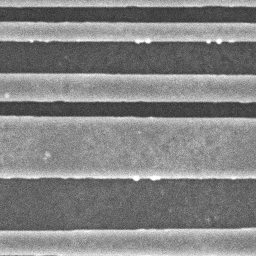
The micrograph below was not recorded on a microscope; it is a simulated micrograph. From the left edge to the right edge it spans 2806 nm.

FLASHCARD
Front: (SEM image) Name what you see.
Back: lines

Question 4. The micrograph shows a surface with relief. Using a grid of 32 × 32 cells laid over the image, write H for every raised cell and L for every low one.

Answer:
HHHHHHHHHHHHHHHHHHHHHHHHHHHHHHHH
LLLLLLLLLLLLLLLLLLLLLLLLLLLLLLLL
LLLLLLLLLLLLLLLLLLLLLLLLLLLLLLLL
HHHHHHHHHHHHHHHHHHHHHHHHHHHHHHHH
HHHHHHHHHHHHHHHHHHHHHHHHHHHHHHHH
LLLLLLLLLLLLLLLLLLLLLLLLLLLLLLLL
LLLLLLLLLLLLLLLLLLLLLLLLLLLLLLLL
LLLLLLLLLLLLLLLLLLLLLLLLLLLLLLLL
LLLLLLLLLLLLLLLLLLLLLLLLLLLLLLLL
HHHHHHHHHHHHHHHHHHHHHHHHHHHHLLLL
HHHHHHHHHHHHHHHHHHHHHHHHHHHHHHHH
HHHHHHHHHHHHHHHHHHHHHHHHHHHHHHHH
HHHHHHHHHHHHHHHHHHHHHHHHHHHHHHHH
LLLLLLLLLLLLLLLLLLLLLLLLLLLLLLLL
LLLLLLLLLLLLLLLLLLLLLLLLLLLLLLLL
HHHHHHHHHHHHHHHHHHHHHHHHHHHHHHHH
HHHHHHHHHHHHHHHHHHHHHHHHHHHHHHHH
HHHHHHHHHHHHHHHHHHHHHHHHHHHHHHHH
HHHHHHHHHHHHHHHHHHHHHHHHHHHHHHHH
HHHHHHHHHHHHHHHHHHHHHHHHHHHHHHHH
HHHHHHHHHHHHHHHHHHHHHHHHHHHHHHHH
HHHHHHHHHHHHHHHHHHHHHHHHHHHHHHHH
LLLLLLLLLLLLLLLLLLLLLLLLLLLLLLLL
LLLLLLLLLLLLLLLLLLLLLLLLLLLLLLLL
LLLLLLLLLLLLLLLLLLLLLLLLLLLLLLLL
LLLLLLLLLLLLLLLLLLLLLLLLLLLLLLLL
LLLLLLLLLLLLLLLLLLLLLLLLLLLLLLLL
LLLLLLLLLLLLLLLLLLLLLLLLLLLLLLLL
LLLLLLLLLLLLLLLLLLLLLLLLLLLLLLLL
HHHHHHHHHHHHHHHHHHHHHHHHHHHHHHHH
HHHHHHHHHHHHHHHHHHHHHHHHHHHHHHHH
HHHHHHHHHHHHHHHHHHHHHHHHHHHHHHHH